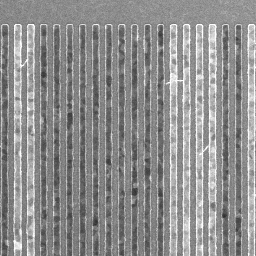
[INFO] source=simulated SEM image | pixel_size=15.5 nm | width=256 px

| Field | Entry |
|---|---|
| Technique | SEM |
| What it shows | parallel lines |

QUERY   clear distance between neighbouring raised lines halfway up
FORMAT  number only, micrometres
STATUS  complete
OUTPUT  0.0949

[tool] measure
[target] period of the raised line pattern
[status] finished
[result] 201 nanometers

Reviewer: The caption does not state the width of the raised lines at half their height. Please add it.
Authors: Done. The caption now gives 106 nm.